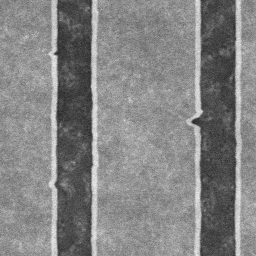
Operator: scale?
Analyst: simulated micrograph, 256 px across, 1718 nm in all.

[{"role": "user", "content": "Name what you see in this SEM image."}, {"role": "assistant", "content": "one or a few lines or trenches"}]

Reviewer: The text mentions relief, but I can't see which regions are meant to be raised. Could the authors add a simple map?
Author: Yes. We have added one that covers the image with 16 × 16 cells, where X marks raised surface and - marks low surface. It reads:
XXX---XXXXXX---X
XXX---XXXXXX---X
XXX---XXXXXX---X
XXX---XXXXXX---X
XXX---XXXXXX---X
XXX---XXXXXX---X
XXX---XXXXXX---X
XXX---XXXXXX---X
XXX---XXXXXX---X
XXX---XXXXXX---X
XXX---XXXXXX---X
XXX---XXXXXX---X
XXX---XXXXXX---X
XXX---XXXXXX---X
XXX---XXXXXX---X
XXX---XXXXXX---X